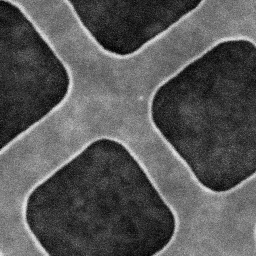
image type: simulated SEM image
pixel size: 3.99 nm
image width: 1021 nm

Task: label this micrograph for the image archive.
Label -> holes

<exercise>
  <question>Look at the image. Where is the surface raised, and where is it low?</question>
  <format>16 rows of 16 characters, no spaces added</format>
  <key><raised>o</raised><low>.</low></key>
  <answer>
.oooo.......oooo
..ooo......ooooo
...ooo....oooo.o
....ooooooooo...
....ooooooo.....
....oooooo......
....ooooo.......
...ooooooo......
.ooooooooo......
ooooo...ooo.....
oooo.....ooo....
oo........ooo..o
oo........oooooo
oo.........ooooo
oo.........ooooo
ooo.......oooooo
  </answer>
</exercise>